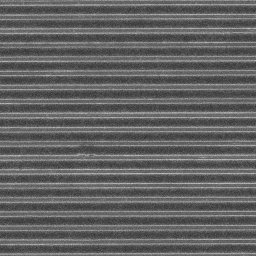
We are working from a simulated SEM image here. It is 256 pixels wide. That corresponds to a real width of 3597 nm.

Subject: parallel lines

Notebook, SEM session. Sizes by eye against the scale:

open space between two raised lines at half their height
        56.2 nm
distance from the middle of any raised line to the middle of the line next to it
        14.1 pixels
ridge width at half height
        0.146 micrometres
